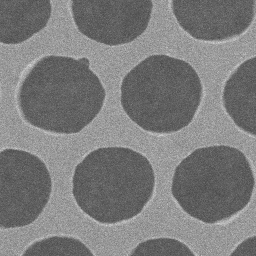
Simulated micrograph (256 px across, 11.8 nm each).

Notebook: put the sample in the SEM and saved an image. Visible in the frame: holes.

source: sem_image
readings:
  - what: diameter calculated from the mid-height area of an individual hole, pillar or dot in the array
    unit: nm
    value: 937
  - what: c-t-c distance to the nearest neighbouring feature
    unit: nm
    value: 1180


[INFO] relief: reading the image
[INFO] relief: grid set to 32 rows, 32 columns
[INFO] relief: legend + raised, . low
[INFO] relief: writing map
......+++..........+++..........
......+++..........+++..........
......+++..........+++..........
.....+++++........+++++........+
....+++++++......+++++++......++
+.+++++++++++..+++++++++++++++++
++++++++++++++++++++++++++++++++
+++++......+++++++.....++++++++.
++++.......++++++.......++++++..
+++.........++++.........++++...
+++..........++..........+++....
++...........++..........+++....
++...........++..........+++....
++...........++..........+++....
+++.........++++........+++++...
++++.......++++++.......+++++...
++++++....+++++++++...+++++++++.
++++++++++++++++++++++++++++++++
+++++++++++++...+++++++++....+++
.....++++++.......+++++........+
......++++.........+++.........+
......+++..........+++..........
......+++..........+++..........
......+++..........++...........
......+++..........+++.........+
......++++........++++.........+
.....++++++.......+++++.......++
....++++++++....+++++++++...++++
.+++++++++++++++++++++++++++++++
++++++++++++++++++++++++++++++++
++++.......++++++......+++++++..
+++........+++++........+++++...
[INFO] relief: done